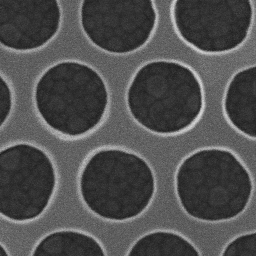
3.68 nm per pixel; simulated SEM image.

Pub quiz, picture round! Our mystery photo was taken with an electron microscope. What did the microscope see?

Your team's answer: holes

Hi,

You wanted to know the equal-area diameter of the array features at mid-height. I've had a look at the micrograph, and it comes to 0.266 µm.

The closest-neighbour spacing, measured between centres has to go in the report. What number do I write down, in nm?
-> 349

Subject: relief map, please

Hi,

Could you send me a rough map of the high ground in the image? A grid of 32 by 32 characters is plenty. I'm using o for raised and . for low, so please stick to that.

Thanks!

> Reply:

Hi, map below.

.......ooo.........ooo.........o
.......ooo.........ooo.........o
.......ooo.........ooo.........o
.......ooo.........ooo.........o
.......oooo........oooo........o
......oooooo......oooooo......oo
oooooooooooooo..oooooooooooooooo
oooooooooooooooooooooooooooooooo
oooooo.....ooooooo.....oooooooo.
ooooo.......ooooo.......ooooo...
.oooo........ooo.........oooo...
.ooo.........ooo.........ooo....
.oooo........ooo.........ooo....
.oooo........ooo.........ooo....
.oooo........oooo........oooo...
oooooo......oooooo......ooooo...
ooooooo....oooooooo...oooooooo..
oooooooooooooooooooooooooooooooo
o....ooooooooooooooooooooooooooo
......oooooo.....ooooooo.....ooo
......ooooo.......ooooo.......oo
.......ooo.........ooo.........o
.......ooo.........ooo.........o
.......ooo.........ooo.........o
......oooo.........ooo.........o
......ooooo.......ooooo........o
.....ooooooo......ooooo.......oo
oo..oooooooooooooooooooooo.ooooo
oooooooooooooooooooooooooooooooo
oooooo.....ooooooo.....ooooooo..
ooooo.......ooooo.......ooooo...
.ooo.........ooo.........ooo....